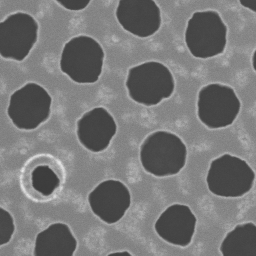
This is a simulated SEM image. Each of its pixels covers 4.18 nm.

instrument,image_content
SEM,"a regular array of holes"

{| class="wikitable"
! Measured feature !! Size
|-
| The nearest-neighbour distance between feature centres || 296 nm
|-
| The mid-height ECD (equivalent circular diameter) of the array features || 0.183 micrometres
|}